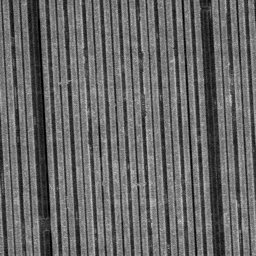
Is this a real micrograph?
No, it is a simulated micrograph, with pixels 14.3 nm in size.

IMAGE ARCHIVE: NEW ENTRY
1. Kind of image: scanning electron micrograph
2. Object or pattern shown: parallel lines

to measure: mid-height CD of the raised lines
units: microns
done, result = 0.0769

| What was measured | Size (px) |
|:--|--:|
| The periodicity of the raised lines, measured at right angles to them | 9.02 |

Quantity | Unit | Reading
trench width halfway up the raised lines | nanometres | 64.4